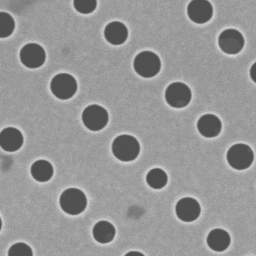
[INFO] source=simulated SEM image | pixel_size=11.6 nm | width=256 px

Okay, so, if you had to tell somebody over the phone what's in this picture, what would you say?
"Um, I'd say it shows a regular array of holes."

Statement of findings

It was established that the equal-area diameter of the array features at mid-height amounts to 295 nanometres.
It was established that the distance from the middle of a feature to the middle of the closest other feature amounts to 502 nm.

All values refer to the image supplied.